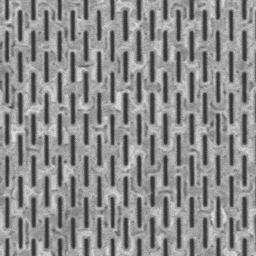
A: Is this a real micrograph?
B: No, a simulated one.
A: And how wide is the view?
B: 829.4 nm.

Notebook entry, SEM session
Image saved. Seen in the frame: a regular array of holes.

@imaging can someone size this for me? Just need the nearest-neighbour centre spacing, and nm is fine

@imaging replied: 77.6